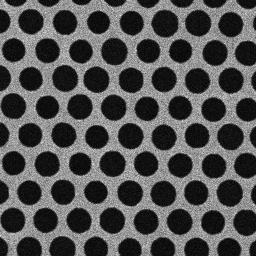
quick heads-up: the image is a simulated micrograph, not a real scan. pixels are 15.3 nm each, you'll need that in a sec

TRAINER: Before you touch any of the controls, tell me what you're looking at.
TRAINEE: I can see a regular array of holes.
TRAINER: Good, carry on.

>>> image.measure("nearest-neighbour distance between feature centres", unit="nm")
490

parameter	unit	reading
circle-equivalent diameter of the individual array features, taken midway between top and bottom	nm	386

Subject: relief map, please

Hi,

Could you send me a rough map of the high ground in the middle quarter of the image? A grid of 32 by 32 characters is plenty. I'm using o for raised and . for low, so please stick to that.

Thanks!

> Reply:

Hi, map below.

..oooooooooooooooooooooooooooooo
...ooo....ooooo....oooo....ooooo
...oo......ooo......oo......ooo.
....o......ooo......oo......oo..
....o......ooo......oo......oo..
...oo......ooo......oo......ooo.
..oooo....ooooo....oooo....oooo.
oooo.ooooooooooooooooooooooooooo
oo....oooo.....oooo...ooooo....o
o......ooo.....ooo.....ooo......
o......oo.......oo......oo......
o......oo.......oo......oo......
o......ooo.....ooo.....ooo......
oo....ooooo....oooo....oooo....o
oooooooooooooooooooooooooooooooo
..ooooo...ooooo....ooooo..ooooo.
...ooo.....ooo......oo......oo..
...oo......oo.......oo......oo..
...oo......oo.......oo......oo..
...oo......ooo......oo......oo..
..oooo....oooo.....oooo....oooo.
oooooooooooooooooooooooo..oooooo
oo....oooo....oooo....oooooo...o
o......oo......ooo.....oooo.....
o......oo.......oo......oo......
o......oo......ooo......oo......
oo.....oo......ooo.....ooo......
oo....oooo....ooooo...ooooo....o
oooooooooooooooooooooooooooooooo
..oooo...oooooo...ooooo...ooooo.
..oooo....oooo.....ooo.....ooo..
...oo......oo.......oo......oo..